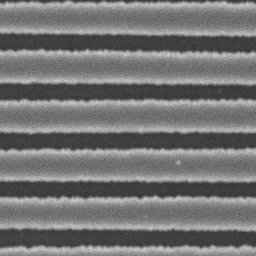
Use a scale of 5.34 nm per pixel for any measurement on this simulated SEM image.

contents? lines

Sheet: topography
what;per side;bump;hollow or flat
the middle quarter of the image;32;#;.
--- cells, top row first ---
################################
################################
################################
################################
################################
................................
................................
................................
................................
################################
################################
################################
################################
################################
################################
################################
################################
................................
................................
................................
................................
##.#.##.##.###.###########.###.#
################################
################################
################################
################################
################################
################################
################################
...............................#
................................
................................